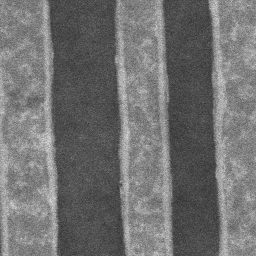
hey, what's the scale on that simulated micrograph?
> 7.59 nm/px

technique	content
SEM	one or a few lines or trenches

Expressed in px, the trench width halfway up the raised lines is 65.7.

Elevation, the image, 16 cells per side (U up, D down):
UUUDDDDUUUDDDUUU
UUUDDDDUUUDDDDUU
UUUDDDDDUUDDDDUU
UUUDDDDDUUDDDDUU
UUUDDDDDUUDDDDUU
UUUDDDDDUUDDDDUU
UUUDDDDDUUDDDDUU
UUUDDDDDUUDDDDUU
UUUDDDDDUUDDDDUU
UUUDDDDDUUDDDDUU
UUUDDDDDUUDDDDUU
UUUDDDDDUUDDDDUU
UUUDDDDDUUDDDDUU
UUUDDDDDUUDDDDUU
UUUDDDDDUUDDDDUU
UUUDDDDDUUDDDDUU